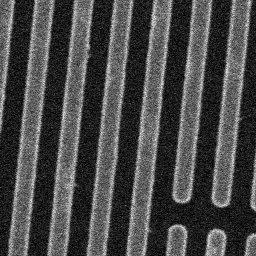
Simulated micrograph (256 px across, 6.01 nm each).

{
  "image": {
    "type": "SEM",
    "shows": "parallel lines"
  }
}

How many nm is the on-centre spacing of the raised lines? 236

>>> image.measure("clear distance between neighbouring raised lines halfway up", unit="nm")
127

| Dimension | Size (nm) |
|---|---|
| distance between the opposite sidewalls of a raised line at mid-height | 111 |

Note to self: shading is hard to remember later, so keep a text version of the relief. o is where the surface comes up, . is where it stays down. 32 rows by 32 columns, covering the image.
oo..ooo..ooo..ooo..oo...oo...oo.
oo..ooo..ooo..oo...oo...oo...oo.
oo..oo...oo...oo...oo...oo...oo.
o...oo...oo...oo...oo...oo...oo.
o...oo...oo...oo...oo...oo...oo.
o...oo...oo...oo...oo...oo...oo.
o...oo...oo...oo...oo..ooo..ooo.
o...oo...oo..ooo..ooo..ooo..ooo.
o..ooo..ooo..ooo..ooo..ooo..ooo.
o..ooo..ooo..ooo..oo...oo...oo..
o..ooo..oo...oo...oo...oo...oo..
...oo...oo...oo...oo...oo...oo..
o..oo...oo...oo...oo...oo...oo..
...oo...oo...oo...oo...oo...oo..
...oo...oo...oo...oo...oo...oo..
...oo...oo...oo...oo...oo..ooo..
...oo...oo...oo..ooo..ooo..ooo..
...oo...oo..ooo..ooo..ooo..ooo..
..ooo..ooo..ooo..ooo..oo...oo...
..ooo..ooo..ooo..oo...oo...oo...
..oo...oo...oo...oo...oo...oo...
..oo...oo...oo...oo...oo...oo...
..oo...oo...oo...oo...oo...oo...
..oo...oo...oo...oo...oo...oo...
..oo...oo...oo...oo...oo...oo...
..oo...oo...oo...oo........o...o
..oo...oo...oo..ooo.............
..oo..ooo..ooo..ooo.............
.ooo..ooo..ooo..ooo..oo.........
.ooo..ooo..oo...oo...oo...oo...o
.oo...oo...oo...oo...oo...oo...o
.oo...oo...oo...oo...oo...oo...o